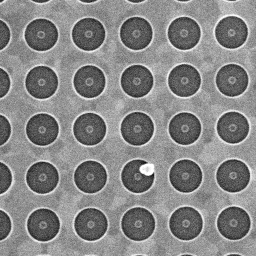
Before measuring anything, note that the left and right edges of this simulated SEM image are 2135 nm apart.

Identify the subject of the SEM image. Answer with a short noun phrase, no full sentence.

an array of small figures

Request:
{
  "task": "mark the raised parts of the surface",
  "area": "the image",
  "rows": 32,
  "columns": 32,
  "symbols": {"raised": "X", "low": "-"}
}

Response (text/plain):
XXXXXXXXXXXXXXXXXXXXXXXXXXXXXXXX
XXXXXXXXXXXXXXXXXXXXXXXXXXXXXXXX
XXXX--XXXX--XXXX--XXXX--XXXX--XX
-XX----XX----XX----XX----XX----X
-XX----XX----XX----XX----XX----X
-XX----XX----XX----XX----XX---XX
XXXXXXXXXXXXXXXXXXXXXXXXXXXXXXXX
XXXXXXXXXXXXXXXXXXXXXXXXXXXXXXXX
XXXX--XXXX--XXXX--XXXX--XXXX--XX
-XX----XX----XX----XX----XX----X
-XX----XX----XX----XX----XX----X
-XX----XXX---XXX---XXX---XXX---X
XXXXXXXXXXXXXXXXXXXXXXXXXXXXXXXX
XXXXXXXXXXXXXXXXXXXXXXXXXXXXXXXX
XXXX---XXX--XXXX---XXX--XXXX---X
-XX----XX----XX----XX----XX----X
-XX----XX----XX----XX----XX----X
-XXX---XXX---XXX---XXX---XXX--XX
XXXXXXXXXXXXXXXXXXXXXXXXXXXXXXXX
XXXXXXXXXXXXXXXXXXXXXXXXXXXXXXXX
-XXX--XXXX---XXX--XXXX---XXX---X
-XX----XX----XX---XXX----XX----X
--X----XX----XX----XX----XX----X
-XXX---XXX---XXX---XXX---XXX---X
XXXXXXXXXXXXXXXXXXXXXXXXXXXXXXXX
XXXXXXXXXXXXXXXXXXXXXXXXXXXXXXXX
-XXX---XXX---XXX---XXX---XXX---X
-XX----XX----XX----XX----XX----X
-XX----XX----XX----XX----XX----X
-XXX---XXX---XXX---XXX---XXX---X
XXXXXXXXXXXXXXXXXXXXXXXXXXXXXXXX
XXXXXXXXXXXXXXXXXXXXXXXXXXXXXXXX